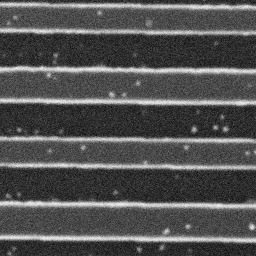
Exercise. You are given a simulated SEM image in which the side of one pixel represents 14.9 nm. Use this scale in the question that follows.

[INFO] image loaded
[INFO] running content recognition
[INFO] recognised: lines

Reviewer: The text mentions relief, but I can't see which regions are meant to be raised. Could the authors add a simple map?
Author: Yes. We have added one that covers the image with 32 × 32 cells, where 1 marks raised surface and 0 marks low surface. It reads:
11111000000000000000000000000000
11111111111111111111111111111111
11111111111111111111111111111111
11111111111111111111111111111111
00000000000000000000000000000000
00000000000000000000000000000000
00000000000000000000000000000000
00000000000000000000000000000000
00110000000000000000000000000000
11111111111111111111111111111111
11111111111111111111111111111111
11111111111111111111111111111111
11111111111111111111111111111111
00000000000000000000000000000000
00000000000000000000000000000000
00000000000000000000000000000000
00000000000000000000000000000000
11111111111111111111111111111110
11111111111111111111111111111111
11111111111111111111111111111111
11111111111111111111111111111111
00000000000000000000000000000000
00000000000000000000000000000000
00000000000000000000000000000000
00000000000000000000000000000000
11111111111111011100000000000000
11111111111111111111111111111111
11111111111111111111111111111111
11111111111111111111111111111111
11111111111111111111111111111111
00000000000000000000000000000000
00000000000000000000000000000000